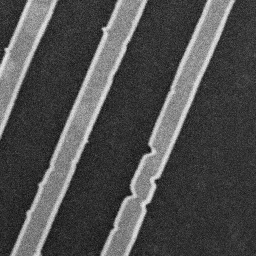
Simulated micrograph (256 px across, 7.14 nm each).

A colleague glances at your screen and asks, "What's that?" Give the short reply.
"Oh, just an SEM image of one or a few lines or trenches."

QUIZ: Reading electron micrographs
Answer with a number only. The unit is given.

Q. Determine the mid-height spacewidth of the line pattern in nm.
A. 435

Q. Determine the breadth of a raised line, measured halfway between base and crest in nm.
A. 151